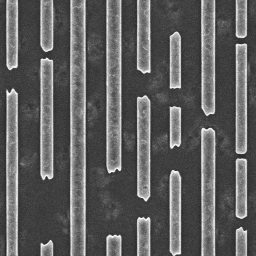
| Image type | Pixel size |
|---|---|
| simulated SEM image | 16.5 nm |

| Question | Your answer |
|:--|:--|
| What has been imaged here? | parallel lines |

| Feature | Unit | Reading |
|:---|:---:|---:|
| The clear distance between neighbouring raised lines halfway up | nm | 340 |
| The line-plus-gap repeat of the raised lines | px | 32.8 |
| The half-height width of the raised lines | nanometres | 198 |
